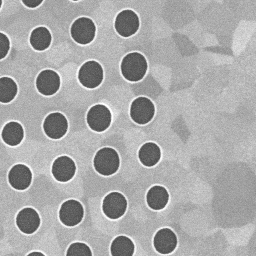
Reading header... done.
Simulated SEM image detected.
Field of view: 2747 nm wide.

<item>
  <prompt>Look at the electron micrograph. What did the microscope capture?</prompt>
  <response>a regular array of holes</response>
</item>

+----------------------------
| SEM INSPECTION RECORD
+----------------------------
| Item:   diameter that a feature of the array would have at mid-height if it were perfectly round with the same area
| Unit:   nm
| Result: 286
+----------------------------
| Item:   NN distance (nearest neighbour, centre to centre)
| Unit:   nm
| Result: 468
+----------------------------